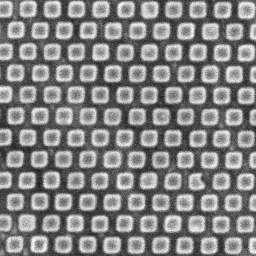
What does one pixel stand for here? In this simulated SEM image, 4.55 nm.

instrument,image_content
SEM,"a regular array of raised bodies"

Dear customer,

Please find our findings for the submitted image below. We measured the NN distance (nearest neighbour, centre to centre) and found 110 nanometres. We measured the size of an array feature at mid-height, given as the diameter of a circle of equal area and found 0.0755 microns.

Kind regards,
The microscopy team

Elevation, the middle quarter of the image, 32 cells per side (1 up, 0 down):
00000000000000000000000000000000
11001111001111000111000111000111
11001111001111000111000111000111
11001111001111000111000111000111
00000000000000000000000000000000
00000000000000000000000000000000
01111001111000111000111000111000
01111001111001111000111000111000
01111001111001111000111000111000
00000000100000010000100000111000
00000000000000000000000000000000
11000111000111000000000011000111
11001111001111000111001111000111
11001111001111001111001111000111
11001111001111001111001111000111
00000000000000000000000000000000
00000000000000000000000000000000
01111001111001111000111000111000
01111001111001111001111000111000
01111001111001111001111000111000
00000000000000000000000000000000
00000000000000000000000000000000
11001111001111000111000111000111
11001111001111001111001111000111
11001111001111001111001111001111
10001110001111000110000111000111
00000000000000000000000000000000
00111000111000111000111000000000
01111001111001111001111000111000
01111001111001111001111000111001
01111001111001111001111001111001
00000000000000000000000000000000